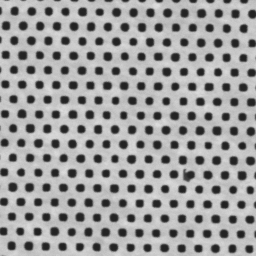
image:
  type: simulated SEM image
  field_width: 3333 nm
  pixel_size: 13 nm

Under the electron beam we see a regular array of holes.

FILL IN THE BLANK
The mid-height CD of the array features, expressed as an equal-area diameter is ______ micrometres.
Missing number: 0.119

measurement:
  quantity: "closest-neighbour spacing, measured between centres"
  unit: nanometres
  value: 218